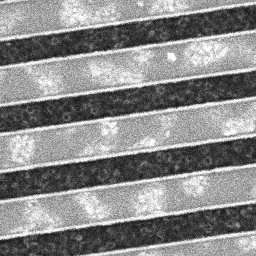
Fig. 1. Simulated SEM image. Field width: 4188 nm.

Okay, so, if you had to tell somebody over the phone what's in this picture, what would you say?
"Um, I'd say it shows one or a few lines or trenches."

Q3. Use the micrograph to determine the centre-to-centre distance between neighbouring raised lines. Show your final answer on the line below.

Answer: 1080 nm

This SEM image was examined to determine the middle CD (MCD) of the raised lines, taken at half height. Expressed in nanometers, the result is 500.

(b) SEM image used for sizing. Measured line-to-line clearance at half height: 0.577 µm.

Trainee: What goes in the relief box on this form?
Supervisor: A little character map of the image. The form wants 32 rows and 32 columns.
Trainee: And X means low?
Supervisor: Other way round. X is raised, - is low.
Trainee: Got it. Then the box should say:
-------------------------------X
------------------------XXXXXXXX
-----------------XXXXXXXXXXXXXXX
----------XXXXXXXXXXXXXXXXXXXXXX
---XXXXXXXXXXXXXXXXXXXXXXXXX----
XXXXXXXXXXXXXXXXXXXXX-----------
XXXXXXXXXXXXXX------------------
XXXXXXX-------------------------
--------------------------------
-------------------------XXXXXXX
------------------XXXXXXXXXXXXXX
-----------XXXXXXXXXXXXXXXXXXXXX
----XXXXXXXXXXXXXXXXXXXXXXXXXXX-
XXXXXXXXXXXXXXXXXXXXXXXX--------
XXXXXXXXXXXXXXXXX---------------
XXXXXXXXXX----------------------
XXX-----------------------------
---------------------------XXXXX
--------------------XXXXXXXXXXXX
-------------XXXXXXXXXXXXXXXXXXX
------XXXXXXXXXXXXXXXXXXXXXXXXXX
XXXXXXXXXXXXXXXXXXXXXXXXXX------
XXXXXXXXXXXXXXXXXXX-------------
XXXXXXXXXXXX--------------------
XXXXX---------------------------
-----------------------------XXX
----------------------XXXXXXXXXX
---------------XXXXXXXXXXXXXXXXX
--------XXXXXXXXXXXXXXXXXXXXXXXX
-XXXXXXXXXXXXXXXXXXXXXXXXXXXX---
XXXXXXXXXXXXXXXXXXXXXX----------
XXXXXXXXXXXXXXX-----------------